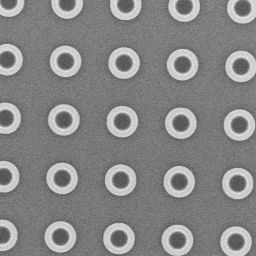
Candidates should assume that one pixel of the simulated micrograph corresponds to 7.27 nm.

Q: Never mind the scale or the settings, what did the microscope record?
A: an array of small figures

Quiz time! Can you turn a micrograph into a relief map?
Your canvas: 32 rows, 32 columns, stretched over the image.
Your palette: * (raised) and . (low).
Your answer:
***...****....****...****...****
**.....***....***....****...****
......................**.....***
................................
................................
................................
***....***....***.....**.....**.
***...****....***....****...****
**....****....***....****...****
........*.....**......**.....***
................................
................................
................................
**.....**.....**................
***...****...****....***....***.
**....****...****....***....****
*......**.....***....***....****
................................
................................
................................
*......*........................
**....***....****....***....***.
**....****...****....***....****
**....***....****....***....****
......................*......**.
................................
................................
................................
**....***....***.....**......*..
**....***....****...****....***.
**....***....****...****....***.
.......*......**.....**.....***.